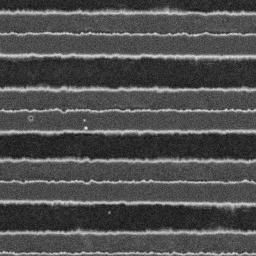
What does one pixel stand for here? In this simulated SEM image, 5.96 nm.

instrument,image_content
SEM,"lines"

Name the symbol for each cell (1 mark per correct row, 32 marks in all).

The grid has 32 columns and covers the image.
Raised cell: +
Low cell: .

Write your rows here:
................................
..+.............................
++++++++++++++++++++++++++++++++
++++++++++++++++++++++++++++++++
++++++++++++++++++++++++++++++++
++++++++++++++++++++++++++++++++
++++++++++++++++++++++++++++++++
................................
................................
................................
................................
++++++++++++++++++++++++++++++++
++++++++++++++++++++++++++++++++
++++++++++++++++++++++++++++++++
++++++++++++++++++++++++++++++++
++++++++++++++++++++++++++++++++
.+++.+++.....+...+.....++.......
................................
................................
................................
++++++++++++++++++++++++++++++++
++++++++++++++++++++++++++++++++
++++++++++++++++++++++++++++++++
++++++++++++++++++++++++++++++++
++++++++++++++++++++++++++++++++
...........................+++++
................................
................................
................................
++++++++++++++++++++++++++++++++
++++++++++++++++++++++++++++++++
++++++++++++++++++++++++++++++++